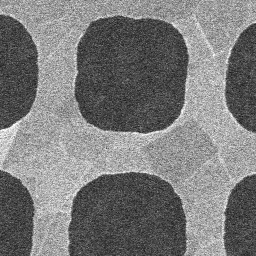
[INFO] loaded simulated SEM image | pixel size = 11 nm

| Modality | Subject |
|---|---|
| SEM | holes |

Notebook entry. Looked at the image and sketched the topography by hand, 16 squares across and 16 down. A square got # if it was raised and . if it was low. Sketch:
################
.#####.....#####
..###.......###.
..###.......##..
..###.......##..
..###.......##..
..###.......##..
.####......####.
################
################
################
.####......####.
..###......###..
..##........##..
..##........##..
..##........##..